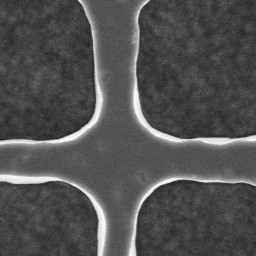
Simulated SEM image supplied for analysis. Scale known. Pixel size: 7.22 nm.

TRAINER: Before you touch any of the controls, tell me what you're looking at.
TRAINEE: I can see holes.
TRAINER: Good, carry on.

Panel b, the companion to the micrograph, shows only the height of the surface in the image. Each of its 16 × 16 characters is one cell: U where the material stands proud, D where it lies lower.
DDDDDUUUUDDDDDDD
DDDDDDUUUDDDDDDD
DDDDDDUUUDDDDDDD
DDDDDDUUUDDDDDDD
DDDDDDUUDDDDDDDD
DDDDDDUUUDDDDDDD
DDDDDDUUUDDDDDDD
DDDDDDUUUDDDDDDD
DDDDUUUUUUDDDDDD
UUUUUUUUUUUUUUUU
UUUUUUUUUUUUUUUU
DDDDUUUUUUDDDDDD
DDDDDDUUUDDDDDDD
DDDDDDUUUDDDDDDD
DDDDDDUUDDDDDDDD
DDDDDDUUDDDDDDDD